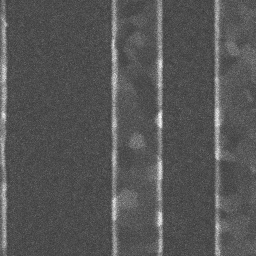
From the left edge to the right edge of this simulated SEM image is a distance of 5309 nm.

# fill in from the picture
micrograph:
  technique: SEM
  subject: one or a few lines or trenches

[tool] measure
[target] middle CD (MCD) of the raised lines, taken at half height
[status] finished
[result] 972 nanometers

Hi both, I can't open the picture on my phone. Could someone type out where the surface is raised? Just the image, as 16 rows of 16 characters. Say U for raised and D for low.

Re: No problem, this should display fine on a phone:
DDDDDDDUUUDDDDUU
DDDDDDDUUUDDDDUU
DDDDDDDUUUDDDDUU
DDDDDDDUUUDDDDUU
DDDDDDDUUUDDDDUU
DDDDDDDUUUDDDDUU
DDDDDDDUUUDDDDUU
DDDDDDDUUUDDDDUU
DDDDDDDUUUDDDDUU
DDDDDDDUUUDDDDUU
DDDDDDDUUUDDDDUU
DDDDDDDUUUDDDDUU
DDDDDDDUUUDDDDUU
DDDDDDDUUUDDDDUU
DDDDDDDUUUDDDDUU
DDDDDDDUUUDDDDUU